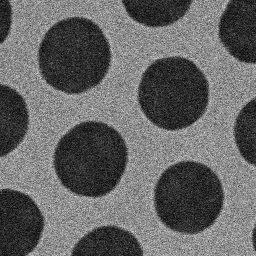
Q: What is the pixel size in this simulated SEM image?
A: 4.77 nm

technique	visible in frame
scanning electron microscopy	holes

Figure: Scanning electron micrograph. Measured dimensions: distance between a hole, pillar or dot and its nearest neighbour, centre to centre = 500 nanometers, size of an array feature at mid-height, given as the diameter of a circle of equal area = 356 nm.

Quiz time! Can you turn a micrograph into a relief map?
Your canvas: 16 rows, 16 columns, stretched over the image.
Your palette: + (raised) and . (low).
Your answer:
.+++++++....++..
.++...+++..+++..
+++....+++++++..
++.....++++++++.
+++....++....+++
.++...+++....+++
..+++++++....++.
..+++++++...+++.
..++....+++++++.
.++.....+++++++.
+++.....++...+++
++++...+++....++
..++++++++....++
...+++++++....++
...+++..+++..+++
..+++....+++++++